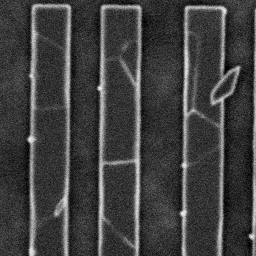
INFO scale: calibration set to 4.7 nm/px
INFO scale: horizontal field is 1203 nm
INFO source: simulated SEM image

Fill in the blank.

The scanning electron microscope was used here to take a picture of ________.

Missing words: wiring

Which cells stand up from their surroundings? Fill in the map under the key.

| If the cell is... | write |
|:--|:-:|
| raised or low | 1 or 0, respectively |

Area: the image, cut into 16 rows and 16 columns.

0011000100001100
0011001110001100
0011001110001100
0011001110001100
0011001110001110
0011001110001110
0011001110001100
0011001110001100
0011001110011100
0011001110011100
0011001110011100
0011001110011100
0011001110011100
0011001110011100
0011001110011100
0011001110011100